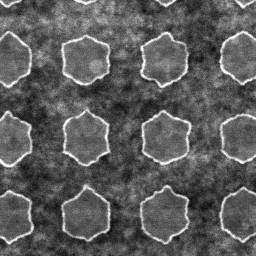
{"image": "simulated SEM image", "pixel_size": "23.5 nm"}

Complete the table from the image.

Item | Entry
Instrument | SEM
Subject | raised bodies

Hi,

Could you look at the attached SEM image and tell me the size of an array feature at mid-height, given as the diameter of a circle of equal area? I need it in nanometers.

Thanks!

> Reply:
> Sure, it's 1150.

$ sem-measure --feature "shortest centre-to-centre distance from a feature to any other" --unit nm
1820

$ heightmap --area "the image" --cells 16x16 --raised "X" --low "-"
----------------
----------------
X----X----X---XX
XX--XXX--XXX--XX
XX--XXX--XXX--XX
----------------
----------------
X---XX---XX---XX
XX--XXX--XXX--XX
XX--XXX--XXX--XX
----------------
----------------
XX--XXX--XXX--XX
XX--XXX--XXX--XX
XX--XX---XX---XX
----------------